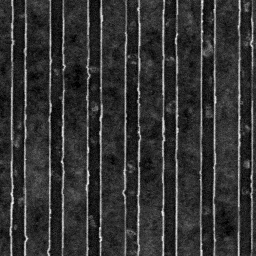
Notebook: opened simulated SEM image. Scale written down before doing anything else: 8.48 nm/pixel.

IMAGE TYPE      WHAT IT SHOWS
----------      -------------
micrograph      parallel lines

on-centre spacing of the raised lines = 321 nm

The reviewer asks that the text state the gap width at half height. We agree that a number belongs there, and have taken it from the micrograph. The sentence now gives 106 nm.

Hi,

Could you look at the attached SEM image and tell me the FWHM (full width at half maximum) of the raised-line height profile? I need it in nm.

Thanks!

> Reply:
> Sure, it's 213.